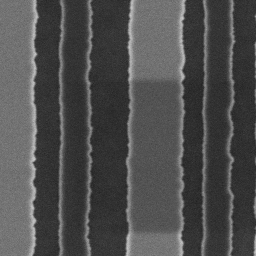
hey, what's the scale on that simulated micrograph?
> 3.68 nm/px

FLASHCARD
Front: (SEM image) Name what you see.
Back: lines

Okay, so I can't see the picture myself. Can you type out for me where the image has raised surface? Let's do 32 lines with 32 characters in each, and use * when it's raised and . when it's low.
*****...***.....*******..****...
*****...***.....*******...***...
*****...***.....*******...***...
****....***.....*******...***...
****....***.....*******...***...
****...****.....*******...***...
****...****.....*******...***...
****...****.....*******...***...
*****...***.....*******...***...
****...****.....*******...***...
****...****.....*******...***...
****...****.....*******...***...
****...****.....*******..****...
****....***.....*******..****...
****....***.....*******..****...
****....***.....*******..****...
*****...***.....*******...***...
****....***.....*******..****...
****....***.....*******..****...
****....***.....*******..****...
****....***.....*******..****...
****...****.....*******..****...
****...****.....*******..****...
****...****.....*******..****...
****...****.....*******..****...
****...****.....*******..****...
****...****.....*******..****...
****...****.....*******..****...
****...****.....*******..****...
****...****.....*******..****...
****...****.....*******..****...
****....***.....*******..****...